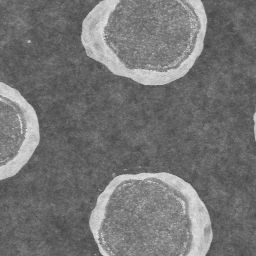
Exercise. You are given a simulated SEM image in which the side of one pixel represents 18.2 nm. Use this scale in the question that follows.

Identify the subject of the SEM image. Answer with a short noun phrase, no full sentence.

raised bodies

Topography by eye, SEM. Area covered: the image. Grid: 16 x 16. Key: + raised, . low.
.......++++++...
......+++++++...
......+++++++...
.......+++++....
........+++.....
................
+...............
++..............
++..............
++..............
+...............
.......+++++....
......++++++....
......+++++++...
......+++++++...
......++++++....